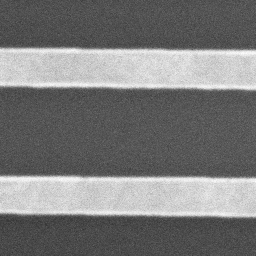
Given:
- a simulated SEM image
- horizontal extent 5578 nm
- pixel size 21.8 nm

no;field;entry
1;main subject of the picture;lines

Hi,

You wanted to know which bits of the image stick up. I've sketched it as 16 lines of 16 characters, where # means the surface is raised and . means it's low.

................
................
................
################
################
...............#
................
................
................
................
................
################
################
................
................
................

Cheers